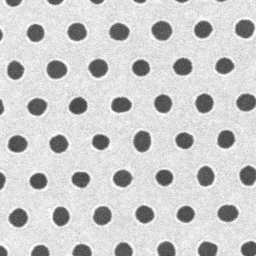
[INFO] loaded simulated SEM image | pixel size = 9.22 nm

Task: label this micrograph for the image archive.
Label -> a regular array of holes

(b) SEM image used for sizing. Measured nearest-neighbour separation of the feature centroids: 41.4 px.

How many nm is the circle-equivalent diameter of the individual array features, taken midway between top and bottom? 189